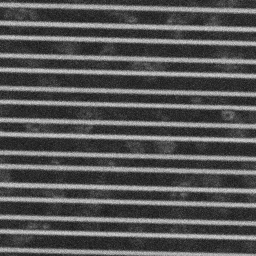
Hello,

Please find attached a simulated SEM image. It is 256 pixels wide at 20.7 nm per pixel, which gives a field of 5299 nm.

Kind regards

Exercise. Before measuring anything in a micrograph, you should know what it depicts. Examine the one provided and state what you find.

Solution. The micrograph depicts parallel lines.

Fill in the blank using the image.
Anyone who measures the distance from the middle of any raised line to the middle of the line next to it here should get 0.337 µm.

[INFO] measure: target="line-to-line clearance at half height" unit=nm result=300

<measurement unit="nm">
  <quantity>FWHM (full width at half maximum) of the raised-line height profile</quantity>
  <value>75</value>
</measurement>